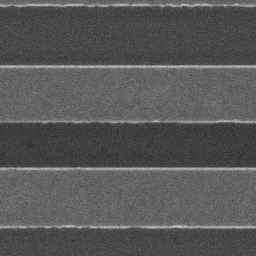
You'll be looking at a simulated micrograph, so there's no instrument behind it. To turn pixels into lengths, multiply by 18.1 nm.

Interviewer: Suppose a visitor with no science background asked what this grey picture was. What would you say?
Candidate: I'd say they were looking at lines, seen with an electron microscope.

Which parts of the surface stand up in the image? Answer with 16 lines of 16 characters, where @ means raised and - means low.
----------------
----------------
----------------
----------------
@@@@@@@@@@@@@@@@
@@@@@@@@@@@@@@@@
@@@@@@@@@@@@@@@@
@@@@@@@@@@@@@@@@
----------------
----------------
----------------
@@@@@@@@@@@@@@@@
@@@@@@@@@@@@@@@@
@@@@@@@@@@@@@@@@
----------------
----------------